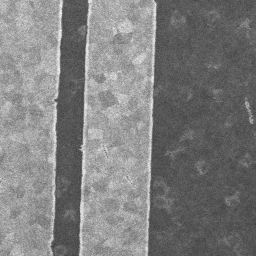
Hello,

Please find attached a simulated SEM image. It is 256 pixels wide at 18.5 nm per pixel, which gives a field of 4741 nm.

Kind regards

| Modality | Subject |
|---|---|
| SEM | one or a few lines or trenches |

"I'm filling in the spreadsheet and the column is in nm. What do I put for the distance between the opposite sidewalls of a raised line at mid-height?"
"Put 1220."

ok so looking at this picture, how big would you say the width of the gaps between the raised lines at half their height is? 0.534 um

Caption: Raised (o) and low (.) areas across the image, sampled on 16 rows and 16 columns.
oooo..oooo......
oooo..oooo......
oooo.ooooo......
oooo.ooooo......
oooo.ooooo......
oooo.ooooo......
ooo..oooo.......
ooo..oooo.......
ooo..oooo.......
ooo..oooo.......
ooo..oooo.......
ooo..oooo.......
ooo..oooo.......
ooo..oooo.......
ooo..oooo.......
ooo..oooo.......